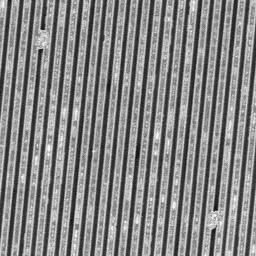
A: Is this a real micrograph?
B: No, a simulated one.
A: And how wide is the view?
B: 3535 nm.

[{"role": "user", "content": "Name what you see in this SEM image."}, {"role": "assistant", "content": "parallel lines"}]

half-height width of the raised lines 0.0928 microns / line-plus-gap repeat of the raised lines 164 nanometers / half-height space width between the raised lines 0.0705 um